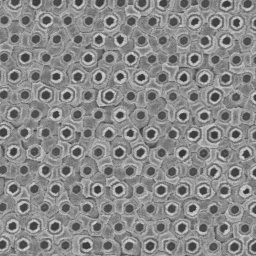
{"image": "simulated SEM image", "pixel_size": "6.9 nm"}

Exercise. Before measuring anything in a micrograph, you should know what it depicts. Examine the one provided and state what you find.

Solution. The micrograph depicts a regular array of holes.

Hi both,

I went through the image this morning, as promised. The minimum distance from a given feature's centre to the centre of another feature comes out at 142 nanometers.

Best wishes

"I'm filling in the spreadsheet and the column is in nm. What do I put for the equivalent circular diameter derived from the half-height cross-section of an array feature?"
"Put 58.8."